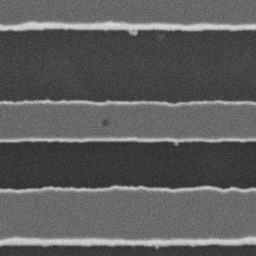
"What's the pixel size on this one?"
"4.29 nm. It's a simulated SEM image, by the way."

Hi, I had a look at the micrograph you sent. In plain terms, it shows lines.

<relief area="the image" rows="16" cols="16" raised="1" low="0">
1111111111111111
1111111111111111
0000000000000000
0000000000000000
0000000000000000
0000000000000000
1111111111111111
1111111111111111
1111111111111111
0000000000000000
0000000000000000
0000000000000000
1111111111111111
1111111111111111
1111111111111111
0000000000000000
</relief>